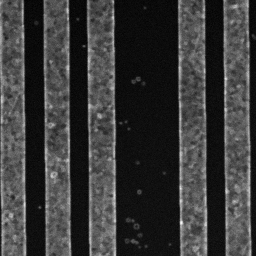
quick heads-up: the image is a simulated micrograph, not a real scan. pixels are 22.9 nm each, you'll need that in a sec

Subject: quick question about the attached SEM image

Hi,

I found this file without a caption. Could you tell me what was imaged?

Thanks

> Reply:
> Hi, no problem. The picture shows wiring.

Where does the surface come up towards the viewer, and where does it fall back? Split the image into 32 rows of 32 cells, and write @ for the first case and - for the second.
@@@---@@---@@@--------@@@@--@@@-
@@@---@@---@@@--------@@@@--@@@-
@@@---@@@--@@@--------@@@@--@@@-
@@@---@@@--@@@--------@@@@--@@@-
@@@---@@@--@@@--------@@@@--@@@-
@@@---@@@--@@@--------@@@@--@@@-
@@@---@@@--@@@--------@@@@--@@@-
@@@---@@@--@@@--------@@@@--@@@-
@@@---@@@--@@@--------@@@@--@@@-
@@@---@@@--@@@--------@@@@--@@@-
@@@---@@@--@@@--------@@@@--@@@-
@@@---@@@--@@@--------@@@@--@@@-
@@@---@@@--@@@--------@@@@--@@@-
@@@---@@@--@@@---------@@@--@@@-
@@@---@@@--@@@---------@@@--@@@-
@@@---@@@--@@@---------@@@--@@@-
@@@---@@@--@@@---------@@@--@@@-
@@@---@@@--@@@---------@@@--@@@-
@@@---@@@--@@@---------@@@--@@@-
@@@---@@@--@@@---------@@@--@@@-
@@@---@@@--@@@---------@@@--@@@-
@@@---@@@--@@@---------@@@--@@@-
@@@---@@@--@@@---------@@@--@@@-
@@@---@@@--@@@---------@@@--@@@-
@@@---@@@--@@@---------@@@--@@@-
@@@---@@@--@@@---------@@@--@@@-
@@@---@@@--@@@---------@@@--@@@-
@@@---@@@--@@@---------@@@--@@@-
@@@---@@@--@@@---------@@@--@@@-
@@@---@@@--@@@---------@@@--@@@-
@@@---@@@--@@@---------@@@--@@@-
@@@---@@@--@@@---------@@@--@@@-